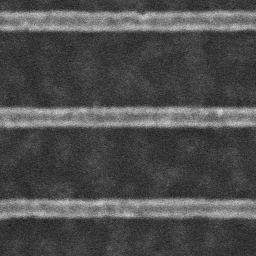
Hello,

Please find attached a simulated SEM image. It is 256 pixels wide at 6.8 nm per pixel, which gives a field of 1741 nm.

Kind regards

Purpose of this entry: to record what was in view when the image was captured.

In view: one or a few lines or trenches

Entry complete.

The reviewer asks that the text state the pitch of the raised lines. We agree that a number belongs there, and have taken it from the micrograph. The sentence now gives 638 nm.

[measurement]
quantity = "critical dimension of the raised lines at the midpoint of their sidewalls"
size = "91.8 nanometres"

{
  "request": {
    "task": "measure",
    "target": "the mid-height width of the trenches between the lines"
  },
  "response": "548 nm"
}